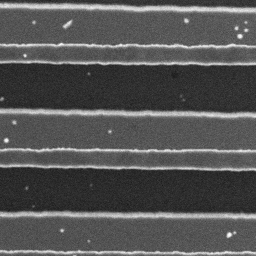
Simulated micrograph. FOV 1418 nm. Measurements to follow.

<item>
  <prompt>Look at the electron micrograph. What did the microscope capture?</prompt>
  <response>lines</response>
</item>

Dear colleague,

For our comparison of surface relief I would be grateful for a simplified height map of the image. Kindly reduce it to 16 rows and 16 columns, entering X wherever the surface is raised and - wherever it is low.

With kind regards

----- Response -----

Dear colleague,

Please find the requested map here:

XXXXX-----------
XXXXXXXXXXXXXXXX
XXXXXXXXXXXXXXXX
XXXXXXXXXXXXXXXX
----------------
----------------
----------------
XXXXXXXXXXXXXXXX
XXXXXXXXXXXXXXXX
XXXXXXXXXXXXXXXX
------XXXXXXXXXX
----------------
----------------
XXXXXXX---------
XXXXXXXXXXXXXXXX
XXXXXXXXXXXXXXXX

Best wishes